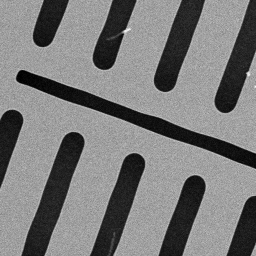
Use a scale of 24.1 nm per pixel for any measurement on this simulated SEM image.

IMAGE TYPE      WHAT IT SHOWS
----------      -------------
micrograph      groups of lines, slits or small figures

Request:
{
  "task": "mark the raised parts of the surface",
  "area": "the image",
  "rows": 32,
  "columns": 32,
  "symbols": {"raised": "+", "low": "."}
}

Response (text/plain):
+++++....+++++...++++++..++++++.
+++++...++++++...+++++...++++++.
+++++...+++++...++++++...+++++..
++++...++++++...+++++...++++++..
++++...+++++...++++++...++++++..
++++..++++++...++++++...+++++...
++++++++++++...+++++...++++++...
++++++++++++..++++++...++++++...
++++++++++++..++++++...+++++...+
++...++++++++++++++...++++++...+
+++.....+++++++++++...+++++...++
+++++......++++++++++++++++...++
++++++++......+++++++++++++...++
+++++++++++.....+++++++++++..+++
...+++++++++++.....+++++++++++++
...++++++++++++++.....++++++++++
..+++++++++++++++++.....++++++++
..++++++...+++++++++++......++++
..+++++...+++++++++++++++.....++
.++++++...++++++..++++++++++....
.++++++...+++++...++++++++++++..
.+++++...++++++...++++++++++++++
++++++...++++++...+++++..+++++++
++++++...+++++...++++++...++++++
+++++...++++++...+++++...+++++++
+++++...++++++...+++++...++++++.
+++++...+++++...++++++...+++++..
++++...++++++...+++++...++++++..
++++...+++++....+++++...+++++...
+++...++++++...++++++...+++++...
+++...++++++...+++++...++++++...
+++...+++++...++++++...+++++....